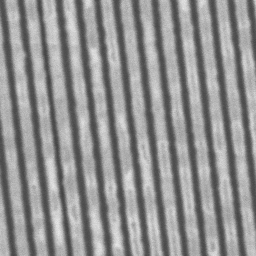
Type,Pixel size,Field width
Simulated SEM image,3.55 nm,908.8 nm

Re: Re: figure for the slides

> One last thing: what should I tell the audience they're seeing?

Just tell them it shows parallel lines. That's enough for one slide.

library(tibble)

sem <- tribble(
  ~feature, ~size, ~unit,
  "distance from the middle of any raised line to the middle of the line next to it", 67.3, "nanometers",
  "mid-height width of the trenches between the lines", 24.2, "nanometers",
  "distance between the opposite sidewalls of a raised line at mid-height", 42.7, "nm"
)